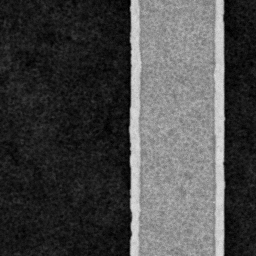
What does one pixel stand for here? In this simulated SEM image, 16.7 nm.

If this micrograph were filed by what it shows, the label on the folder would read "one or a few lines or trenches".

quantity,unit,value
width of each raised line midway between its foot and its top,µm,1.43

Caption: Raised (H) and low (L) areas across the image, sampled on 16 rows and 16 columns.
LLLLLLLLHHHHHHLL
LLLLLLLLHHHHHHLL
LLLLLLLLHHHHHHLL
LLLLLLLLHHHHHHLL
LLLLLLLLHHHHHHLL
LLLLLLLLHHHHHHLL
LLLLLLLLHHHHHHLL
LLLLLLLLHHHHHHLL
LLLLLLLLHHHHHHLL
LLLLLLLLHHHHHHLL
LLLLLLLLHHHHHHLL
LLLLLLLLHHHHHHLL
LLLLLLLLHHHHHHLL
LLLLLLLLHHHHHHLL
LLLLLLLLHHHHHHLL
LLLLLLLLHHHHHHLL